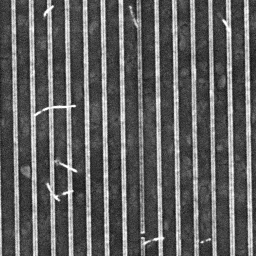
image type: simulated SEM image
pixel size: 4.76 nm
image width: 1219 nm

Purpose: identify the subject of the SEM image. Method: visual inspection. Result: parallel lines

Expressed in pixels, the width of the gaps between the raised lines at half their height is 14.5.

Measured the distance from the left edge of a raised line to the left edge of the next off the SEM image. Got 85.2 nanometers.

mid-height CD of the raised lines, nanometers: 16.1